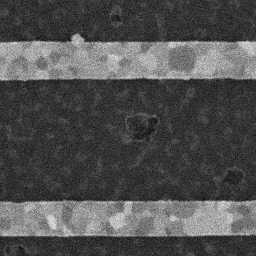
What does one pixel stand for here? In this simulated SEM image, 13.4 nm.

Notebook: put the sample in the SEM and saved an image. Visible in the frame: one or a few lines or trenches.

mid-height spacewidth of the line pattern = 1660 nanometres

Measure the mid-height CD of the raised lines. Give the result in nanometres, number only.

472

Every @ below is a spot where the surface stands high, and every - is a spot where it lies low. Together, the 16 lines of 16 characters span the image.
----------------
----------------
----@-----------
@@@@@@@@@@@@@@@@
@@@@@@@@@@@@@@@@
----------------
----------------
--------@-------
----------------
----------------
----------------
----------------
----------------
@@@@@@@@@@@@@@@@
@@@@@@@@@@@@@@@@
----------------